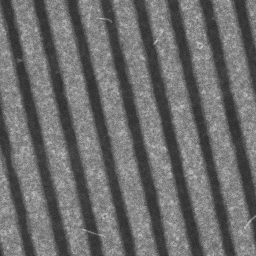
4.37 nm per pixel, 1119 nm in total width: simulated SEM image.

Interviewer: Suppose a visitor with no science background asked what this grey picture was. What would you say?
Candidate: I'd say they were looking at parallel lines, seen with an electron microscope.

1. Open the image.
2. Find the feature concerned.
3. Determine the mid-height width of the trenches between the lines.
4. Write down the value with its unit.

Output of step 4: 91.5 nm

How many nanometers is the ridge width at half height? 50